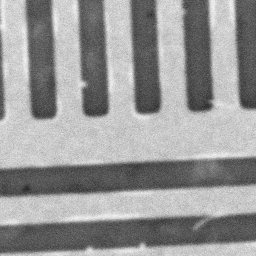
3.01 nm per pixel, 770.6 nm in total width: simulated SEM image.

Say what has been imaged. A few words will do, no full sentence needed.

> groups of lines, slits or small figures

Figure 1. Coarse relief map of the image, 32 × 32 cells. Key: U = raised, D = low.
UUUDDDDUUDDDDUUUDDDDUUUDDDDUUDDD
UUUDDDDUUUDDDUUUDDDDUUUDDDDUUDDD
UUUDDDDUUUDDDUUUDDDDUUUDDDDUUDDD
UUUDDDDUUUDDDUUUDDDDUUUDDDUUUDDD
UUUDDDDUUUDDDUUUDDDDUUUDDDUUUDDD
UUUDDDDUUUDDDUUUDDDDUUUDDDDUUDDD
UUUDDDDUUUDDDUUUDDDDUUUDDDDUUUDD
UUUDDDDUUUDDDDUUDDDDUUUDDDDUUUDD
DUUDDDDUUUDDDDUUDDDDUUUDDDDUUUDD
DUUDDDDUUUDDDDUUDDDDUUUDDDDUUUDD
DUUUDDDUUUDDDDUUUDDDUUUDDDDUUUDD
DUUUDDDUUUDDDDUUUDDDUUUDDDDUUUDD
DUUUDDDUUUDDDDUUUDDDUUUDDDDUUUDD
DUUUDDDUUUDDDDUUUDDDUUUDDDUUUUDD
DUUUDDDUUUUDDUUUUDDUUUUUUUUUUUUU
UUUUUUUUUUUUUUUUUUUUUUUUUUUUUUUU
UUUUUUUUUUUUUUUUUUUUUUUUUUUUUUUU
UUUUUUUUUUUUUUUUUUUUUUUUUUUUUUUU
UUUUUUUUUUUUUUUUUUUUUUUUUUUUUUUU
UUUUUUUUUUUUUUUUUUUUUUUUUUUUDDUD
UUUUUUUUUDDDDDDDDDDDDDDDDDDDDDDD
DDDDDDDDDDDDDDDDDDDDDDDDDDDDDDDD
DDDDDDDDDDDDDDDDDDDDDDDDDDDDDDDD
DDDDDDDDDDDDDDDDDDDDDDDDDDDUUUUU
DDDDDDUUUUUUUUUUUUUUUUUUUUUUUUUU
UUUUUUUUUUUUUUUUUUUUUUUUUUUUUUUU
UUUUUUUUUUUUUUUUUUUUUUUUUUUUUUUU
UUUUUUUUUDDDDDDDDDDDDDDDDDDDDDDD
DDDDDDDDDDDDDDDDDDDDDDDDDDDDDDDD
DDDDDDDDDDDDDDDDDDDDDDDDDDDDDDDD
DDDDDDDDDDDDDDDDDDDDDDDDDDDDDDDD
DDDDDDDDDUUUUUUUUUUUUUUUUUUUUUUU